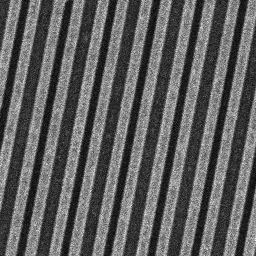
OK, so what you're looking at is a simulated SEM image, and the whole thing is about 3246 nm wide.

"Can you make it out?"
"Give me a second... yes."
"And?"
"parallel lines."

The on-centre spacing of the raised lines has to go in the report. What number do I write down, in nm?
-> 271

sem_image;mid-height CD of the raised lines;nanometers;132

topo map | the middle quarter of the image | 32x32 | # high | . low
##...###..###...###..###...###..
##...###..###...###..###...###..
##...###..###...###..##....##...
#....##...##....##..###....##...
#....##..###...###..###....##..#
#....##..###...###..###...###..#
#...###..###...###..###...###..#
#...###..##....###..##....##...#
....##...##....##...##....##...#
....##...##....##..###....##..##
....##..###...###..###...###..##
...###..###...###..###...###..##
...###..##....##...##....##...##
...###..###...##...##....##...##
...##...##....##..###....##..###
...##..###...###..###...###..###
..###..###...###..###...###..###
..###..###...###..##....###..##.
..###..##....###..##....##...##.
..##...##....##..###....##..###.
..##..###...###..###...###..###.
.###..###...###..###...###..###.
.###..###...###..##....###..##..
.###..##....###..##....##...##..
.##...##....##..###....##..###..
.##..###...###..###...###..###..
###..###...###..###...###..###..
###..###...###..##....###..##...
###..##....##...##....##...##...
##...##....##..###....##..###...
##..###...###..###...###..###...
##..###...###..###...###..###...